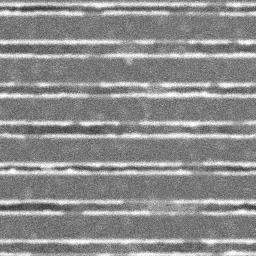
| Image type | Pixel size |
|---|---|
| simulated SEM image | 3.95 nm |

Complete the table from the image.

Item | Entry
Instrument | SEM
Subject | parallel lines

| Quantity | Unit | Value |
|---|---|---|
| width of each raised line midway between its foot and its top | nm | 124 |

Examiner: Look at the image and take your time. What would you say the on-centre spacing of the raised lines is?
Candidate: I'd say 158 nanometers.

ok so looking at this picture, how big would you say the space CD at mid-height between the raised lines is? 0.0346 µm